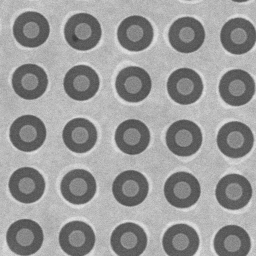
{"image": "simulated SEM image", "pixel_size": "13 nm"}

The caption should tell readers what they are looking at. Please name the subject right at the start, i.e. an array of small figures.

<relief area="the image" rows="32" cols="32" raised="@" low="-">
@@@@@@@@@@@@@@@@@@@@@@@@@@@@@@@@
@@@--@@@@@@@@@@@@@@@@@@@@@@@@@@@
@@----@@----@@@----@@@---@@@@--@
@@----@@-----@@----@@----@@@----
@@----@@-----@@----@@-----@-----
@@---@@@----@@@----@@----@@@----
@@@@@@@@@@@@@@@@-@@@@@--@@@@---@
@@@@@@@@@@@@@@@@@@@@@@@@@@@@@@@@
@@---@@@@---@@@---@@@@@@@@@@@@@@
@-----@@----@@-----@@----@@@----
@-----@@-----@-----@@-----@-----
@@----@@----@@-----@@-----@-----
@@@@@@@@@--@@@@---@@@----@@@---@
@@@@@@@@@@@@@@@@@@@@@@@@@@@@@@@@
@@@-@@@@@@@@@@@@@@@@@@@@@@@@@@@@
@-----@@----@@@---@@@----@@@---@
@-----@@----@@-----@-----@@-----
@-----@@----@@-----@-----@@-----
@@---@@@----@@@---@@@----@@-----
@@@@@@@@@@@@@@@@@@@@@@--@@@@---@
@@@@@@@@@@@@@@@@@@@@@@@@@@@@@@@@
@@---@@@---@@@@--@@@@@--@@@@@-@@
@-----@-----@@-----@@----@@----@
@-----@-----@@-----@-----@@-----
@----@@@----@@----@@@----@@----@
@@@@@@@@@--@@@@--@@@@---@@@----@
@@@@@@@@@@@@@@@@@@@@@@@@@@@@@@@@
@@--@@@@@--@@@@@@@@@@@@@@@@@@@@@
@----@@@----@@----@@@---@@@@--@@
@----@@-----@@-----@-----@@----@
@----@@-----@@----@@-----@@-----
@----@@@----@@----@@@----@@----@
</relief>